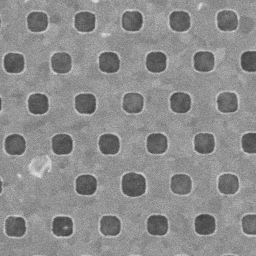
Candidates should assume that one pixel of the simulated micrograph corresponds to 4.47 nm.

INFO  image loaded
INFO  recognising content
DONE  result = a regular array of holes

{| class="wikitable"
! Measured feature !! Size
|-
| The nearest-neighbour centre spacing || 0.21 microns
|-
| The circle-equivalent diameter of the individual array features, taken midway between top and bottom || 102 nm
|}